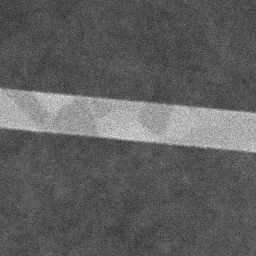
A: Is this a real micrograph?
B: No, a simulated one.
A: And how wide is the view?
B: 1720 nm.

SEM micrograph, one or a few lines or trenches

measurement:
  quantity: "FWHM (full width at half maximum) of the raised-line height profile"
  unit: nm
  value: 252